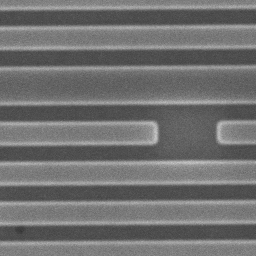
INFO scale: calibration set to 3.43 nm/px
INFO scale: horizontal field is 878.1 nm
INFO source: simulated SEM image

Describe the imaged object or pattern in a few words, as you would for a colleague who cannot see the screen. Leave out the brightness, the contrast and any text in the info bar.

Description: groups of lines, slits or small figures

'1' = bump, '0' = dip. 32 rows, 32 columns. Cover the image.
11111111111111111111111111111111
00000000000000000000000000000000
00000000000000000000000000000000
01111111111111111111111111111111
11111111111111111111111111111111
11111111111111111111111111111111
00000000000000000000000000000000
00000000000000000000000000000000
00000000000000111111111111111111
11111111111111111111111111111111
11111111111111111111111111111111
11111111111111111111111111111111
11111111111111111111111111111111
00000000000000000000000000000000
00000000000000000000000000000000
11111111111111111110000000001111
11111111111111111110000000011111
11111111111111111110000000011111
00000000000000000000000000000000
00000000000000000000000000000000
11111111111111111111111111111111
11111111111111111111111111111111
11111111111111111111111111111111
00000000000000000000000000000000
00000000000000000000000000000000
11111111111111111111111111111111
11111111111111111111111111111111
11111111111111111111111111111111
00000000000000000000000000000000
00000000000000000000000000000000
11111111111111111111111111111111
11111111111111111111111111111111